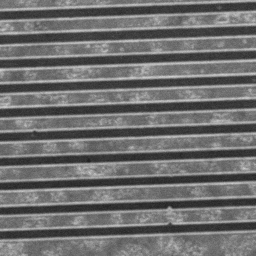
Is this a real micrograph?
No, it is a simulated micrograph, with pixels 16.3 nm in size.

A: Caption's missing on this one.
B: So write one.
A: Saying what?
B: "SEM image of parallel lines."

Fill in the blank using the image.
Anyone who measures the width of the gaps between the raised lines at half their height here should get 173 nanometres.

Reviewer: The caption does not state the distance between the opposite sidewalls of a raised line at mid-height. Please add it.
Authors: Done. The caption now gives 236 nm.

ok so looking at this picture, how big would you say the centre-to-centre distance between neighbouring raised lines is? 0.398 microns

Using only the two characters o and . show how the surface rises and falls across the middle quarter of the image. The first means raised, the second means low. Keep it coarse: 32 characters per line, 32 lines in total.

.........ooooooooooooooooooooooo
oooooooooooooooooooooooooooooooo
oooooooooooooooooooooooooooooooo
oooooooooooooooooooo............
................................
................................
..................oooooooooooooo
oooooooooooooooooooooooooooooooo
oooooooooooooooooooooooooooooooo
ooooooooooooooooooooooo.........
................................
................................
....................oooooooooooo
oooooooooooooooooooooooooooooooo
oooooooooooooooooooooooooooooooo
ooooooooooooooooooooo...........
................................
................................
................oooooooooooooooo
oooooooooooooooooooooooooooooooo
oooooooooooooooooooooooooooooooo
oooooooooooooooooooooooooooo....
................................
................................
..................oooooooooooooo
oooooooooooooooooooooooooooooooo
oooooooooooooooooooooooooooooooo
oooooooooooooooooooooooooooooo..
ooo.............................
................................
.....................ooooooooooo
oooooooooooooooooooooooooooooooo